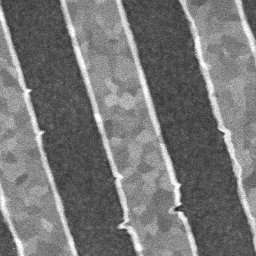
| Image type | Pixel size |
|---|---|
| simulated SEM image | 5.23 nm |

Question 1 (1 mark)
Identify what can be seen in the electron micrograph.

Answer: one or a few lines or trenches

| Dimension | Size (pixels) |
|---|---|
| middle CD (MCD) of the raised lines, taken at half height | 52.6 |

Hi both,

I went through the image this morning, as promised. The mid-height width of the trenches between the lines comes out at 330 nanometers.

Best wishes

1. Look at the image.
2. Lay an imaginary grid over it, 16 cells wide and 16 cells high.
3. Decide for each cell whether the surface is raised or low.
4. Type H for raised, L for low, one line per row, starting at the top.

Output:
LLLLHHHHLLLLHHHL
LLLLHHHHLLLLHHHL
HLLLLHHHLLLLHHHH
HLLLLHHHLLLLLHHH
HLLLLHHHHLLLLHHH
HHLLLLHHHLLLLHHH
HHLLLLHHHLLLLHHH
HHLLLLHHHHLLLLHH
HHLLLLHHHHLLLLHH
HHHLLLLHHHLLLLHH
HHHLLLLHHHHLLLLH
HHHLLLLHHHHLLLLH
HHHHLLLLHHHLLLLH
HHHHLLLLHHHLLLLL
LHHHLLLLHHHHLLLL
LHHHHLLLLHHHLLLL